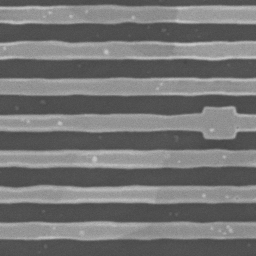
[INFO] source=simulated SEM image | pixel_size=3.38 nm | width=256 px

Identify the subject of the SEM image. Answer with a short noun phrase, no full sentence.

wiring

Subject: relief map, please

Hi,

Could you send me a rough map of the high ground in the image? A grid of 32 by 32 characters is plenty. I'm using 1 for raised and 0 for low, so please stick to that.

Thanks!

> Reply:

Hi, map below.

00000000000000000000000000000000
00111111111111111111111111111111
01111111111111111111111111111111
00000000000000000000000000000000
00000000000000000000000000000000
11111111111111111111100111111111
11111111111111111111000111111111
00000000000000000000000000110000
00000000000000000000000000000000
00000000000000000000000000000000
11111111111111111111111111111111
11111111111111111111111111111111
00000000000000000000000000000000
00000000000000000000000000111000
11111111111111111111111111111111
11111111111111111111111111111111
00000000000000000000000001111100
00000000000000000000000000000000
00000000000000000000000000000000
11111111111111111111111111111111
11111111111111111111111111111111
00000000000000000000000000000000
00000000000000000000000000000000
11111111111111111111111111111111
11111111111111111111111111111111
00000000000000000000000000000000
00000000000000000000000000000000
00000000000000000000000000000000
11111111111111111111111111111111
11111111111111111111111111111111
00000000000000000000000000000000
00000000000000000000000000000000